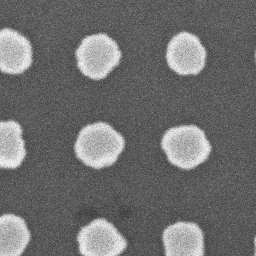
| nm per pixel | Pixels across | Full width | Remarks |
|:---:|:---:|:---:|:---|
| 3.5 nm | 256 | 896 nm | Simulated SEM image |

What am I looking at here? raised bodies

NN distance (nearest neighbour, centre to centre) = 307 nm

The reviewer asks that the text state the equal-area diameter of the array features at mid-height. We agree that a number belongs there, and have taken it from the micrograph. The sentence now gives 145 nm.